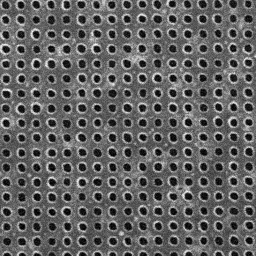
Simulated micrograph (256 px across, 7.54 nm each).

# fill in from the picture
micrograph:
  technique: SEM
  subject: a regular array of holes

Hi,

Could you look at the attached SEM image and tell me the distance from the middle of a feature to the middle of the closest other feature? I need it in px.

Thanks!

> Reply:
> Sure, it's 14.6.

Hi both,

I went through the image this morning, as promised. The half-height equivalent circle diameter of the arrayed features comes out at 0.0619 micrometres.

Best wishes